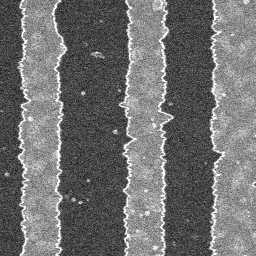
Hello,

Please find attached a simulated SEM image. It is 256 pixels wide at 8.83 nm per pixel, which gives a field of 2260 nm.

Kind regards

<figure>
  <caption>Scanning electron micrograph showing one or a few lines or trenches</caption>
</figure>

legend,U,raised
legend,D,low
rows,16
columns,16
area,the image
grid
UDDUUUUUDDUUUDDD
UDDUUUUUDDUUUDDD
UUDDUUUUDDUUUDDD
UDDDUUUUDDUUUDDD
UDDDUUUUDDUUUDDD
UUDDUUUUDDUUUDDD
UUDDUUUUDDUUUUDD
UDDDUUUUDDUUUDDD
UDDDUUUUDDUUUDDD
UDDDUUUUDDUUUUDD
UUDDUUUUDDUUUUDD
UUDDUUUUDDUUUDDD
UDDDUUUUDDUUUDDD
UUDDUUUUDDUUUDDD
UUDDUUUUDDUUUDDD
UUDDUUUUDDUUUDDD